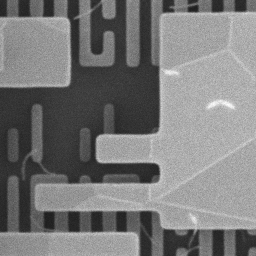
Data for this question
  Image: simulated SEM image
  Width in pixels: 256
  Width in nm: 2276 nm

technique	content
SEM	wiring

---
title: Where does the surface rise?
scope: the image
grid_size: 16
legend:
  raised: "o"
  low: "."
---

................
oooo......oooooo
oooo......oooooo
oooo......oooooo
oooo......oooooo
..........oooooo
..........oooooo
..........oooooo
......oooooooooo
......oooooooooo
..........oooooo
...ooooooooooooo
..oooooooooooooo
..........oooooo
................
ooooooooo.......